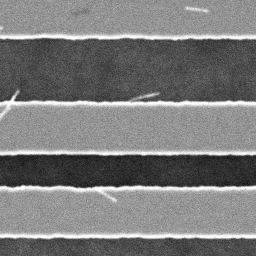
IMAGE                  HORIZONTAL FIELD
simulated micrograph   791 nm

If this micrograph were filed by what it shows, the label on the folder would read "lines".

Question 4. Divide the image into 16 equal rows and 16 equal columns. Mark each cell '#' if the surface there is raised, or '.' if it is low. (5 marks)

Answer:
################
################
................
................
................
................
################
################
################
################
................
................
################
################
################
................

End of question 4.